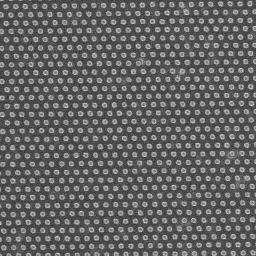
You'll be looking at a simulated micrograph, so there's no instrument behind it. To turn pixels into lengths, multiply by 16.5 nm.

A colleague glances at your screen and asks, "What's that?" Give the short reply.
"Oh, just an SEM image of a regular array of raised bodies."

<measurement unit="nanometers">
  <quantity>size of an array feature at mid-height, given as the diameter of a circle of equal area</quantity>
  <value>79.1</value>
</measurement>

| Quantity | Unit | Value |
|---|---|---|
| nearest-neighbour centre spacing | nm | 155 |